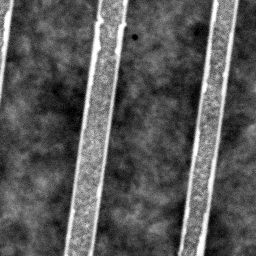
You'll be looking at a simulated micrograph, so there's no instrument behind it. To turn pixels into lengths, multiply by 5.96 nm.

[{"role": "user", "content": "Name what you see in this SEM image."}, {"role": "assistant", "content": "one or a few lines or trenches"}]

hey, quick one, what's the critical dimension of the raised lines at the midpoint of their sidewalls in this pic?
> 23.2 px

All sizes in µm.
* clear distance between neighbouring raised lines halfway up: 0.52